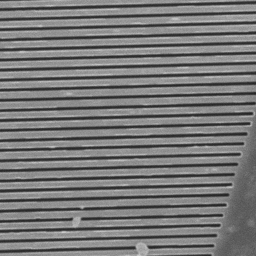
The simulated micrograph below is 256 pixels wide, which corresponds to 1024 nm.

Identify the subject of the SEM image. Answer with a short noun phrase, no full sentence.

parallel lines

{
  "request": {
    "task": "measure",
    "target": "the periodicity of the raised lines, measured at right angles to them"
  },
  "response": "40.3 nm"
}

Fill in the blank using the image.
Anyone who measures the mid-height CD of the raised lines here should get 0.0275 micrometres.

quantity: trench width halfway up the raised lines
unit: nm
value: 13.5